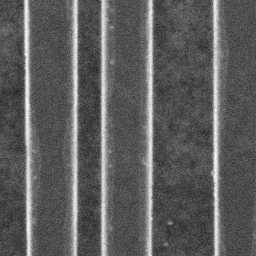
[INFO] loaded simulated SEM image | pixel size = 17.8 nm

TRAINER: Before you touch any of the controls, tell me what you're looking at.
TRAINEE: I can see lines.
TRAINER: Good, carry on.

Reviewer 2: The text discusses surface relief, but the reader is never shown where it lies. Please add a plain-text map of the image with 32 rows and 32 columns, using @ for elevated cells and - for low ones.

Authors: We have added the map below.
---@@@@@@----@@@@@@--------@@@@@
---@@@@@@----@@@@@@--------@@@@@
---@@@@@@----@@@@@@--------@@@@@
---@@@@@@----@@@@@@--------@@@@@
---@@@@@@----@@@@@@--------@@@@@
---@@@@@@----@@@@@@--------@@@@@
---@@@@@@----@@@@@@--------@@@@@
---@@@@@@----@@@@@@--------@@@@@
---@@@@@@----@@@@@@--------@@@@@
---@@@@@@----@@@@@@--------@@@@@
---@@@@@@----@@@@@@--------@@@@@
---@@@@@@----@@@@@@--------@@@@@
---@@@@@@----@@@@@@--------@@@@@
---@@@@@@----@@@@@@--------@@@@@
---@@@@@@----@@@@@@--------@@@@@
---@@@@@@----@@@@@@--------@@@@@
----@@@@@----@@@@@@--------@@@@@
----@@@@@----@@@@@@--------@@@@@
----@@@@@----@@@@@@--------@@@@@
----@@@@@----@@@@@@--------@@@@@
----@@@@@----@@@@@@--------@@@@@
----@@@@@----@@@@@@--------@@@@@
----@@@@@----@@@@@@--------@@@@@
----@@@@@----@@@@@@--------@@@@@
----@@@@@----@@@@@@--------@@@@@
----@@@@@----@@@@@@--------@@@@@
----@@@@@----@@@@@@--------@@@@@
----@@@@@----@@@@@@--------@@@@@
----@@@@@----@@@@@@--------@@@@@
----@@@@@----@@@@@@--------@@@@@
----@@@@@----@@@@@@--------@@@@@
----@@@@@----@@@@@@--------@@@@@